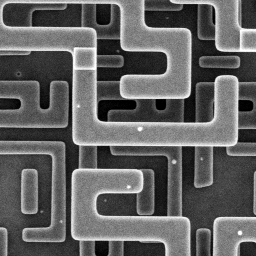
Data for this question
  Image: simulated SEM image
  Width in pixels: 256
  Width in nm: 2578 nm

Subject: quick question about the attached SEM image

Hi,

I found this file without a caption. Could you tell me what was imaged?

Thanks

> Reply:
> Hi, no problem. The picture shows wiring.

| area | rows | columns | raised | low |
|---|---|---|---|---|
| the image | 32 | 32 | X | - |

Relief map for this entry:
X-------------XXXX--------XXXX--
---------------XXX---------XXX--
---------------XXX---------XXX--
XXXXXXXXXX-----XXXX--------XXX--
XXXXXXXXXXXX---XXXXXXXXX---XXXXX
XXXXXXXXXXXX---XXXXXXXXX---XXXXX
---------XXX--------XXXX--------
---------XXX---------XXX--------
---------XXX---------XXX--------
---------XXX----XXXXXXXX---XX---
---------XXX---XXXXXXXXX---XXX--
---------XXX---XXXXXXXXX---XXX--
---------XXX---------------XXX--
---------XXX---------------XXX--
---------XXX---------------XXX--
---------XXXXXXXXXXXXXXXXXXXXX--
---------XXXXXXXXXXXXXXXXXXXXX--
---------XXXXXXXXXXXXXXXXXXXXX--
--------------------------------
--------------------------------
--------------------------------
---------XXXXXXXXX--------------
---------XXXXXXXXX--------------
---------XXXXXXXXX--------------
---------XXX--------------------
---------XXX--------------------
---------XXX--------------------
---------XXXXXXXXXXXXXXX---XXXXX
---------XXXXXXXXXXXXXXX---XXXXX
---------XXXXXXXXXXXXXXX---XXXXX
--------------------XXXX---XXX--
---------------------XXX---XXX--